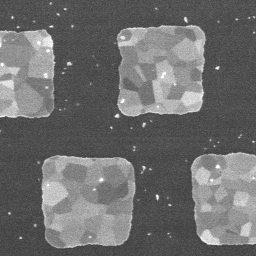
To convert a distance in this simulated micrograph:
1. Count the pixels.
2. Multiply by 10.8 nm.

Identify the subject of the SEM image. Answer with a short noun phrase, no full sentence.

raised bodies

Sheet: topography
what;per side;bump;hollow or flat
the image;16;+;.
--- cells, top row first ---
................
................
+++....++++++...
+++.....+++++...
+++....++++++...
+++....++++++...
+++....++++++...
................
................
................
...+++++....++++
...+++++....++++
...+++++....++++
...+++++....++++
...+++++....++++
................